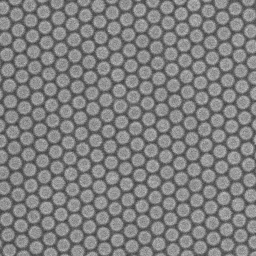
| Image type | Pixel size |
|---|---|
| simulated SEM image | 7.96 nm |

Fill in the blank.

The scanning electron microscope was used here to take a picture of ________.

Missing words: a regular array of raised bodies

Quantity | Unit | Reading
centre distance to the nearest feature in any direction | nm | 122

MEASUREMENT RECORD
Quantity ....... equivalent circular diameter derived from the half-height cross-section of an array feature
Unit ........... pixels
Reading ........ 11.9